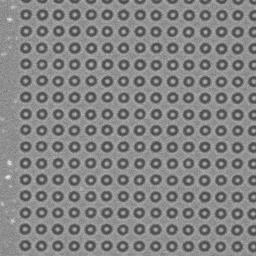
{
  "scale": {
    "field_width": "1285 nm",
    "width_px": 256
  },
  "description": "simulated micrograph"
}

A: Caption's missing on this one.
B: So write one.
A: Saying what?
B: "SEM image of a regular array of ring-shaped grooves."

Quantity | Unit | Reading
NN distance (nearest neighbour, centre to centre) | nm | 79.1